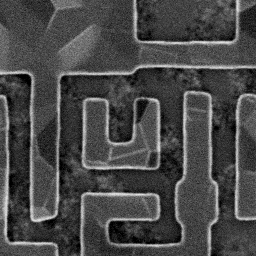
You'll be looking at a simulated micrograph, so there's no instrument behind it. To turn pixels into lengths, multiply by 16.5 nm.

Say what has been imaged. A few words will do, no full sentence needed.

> wiring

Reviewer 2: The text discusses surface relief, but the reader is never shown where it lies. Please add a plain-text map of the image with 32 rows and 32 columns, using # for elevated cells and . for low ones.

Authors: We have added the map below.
#################.............##
#################.............##
#################.............##
#################.............##
#################.............##
################################
################################
################################
#################...............
....####........................
....###.........................
....###.........................
#...###....##....##....###....##
#...###...####...###...###....##
#...###...####...###...###....##
#...###...###....###...###....##
#...###...###....###...###....##
#...###...####..####...###....##
#...###...##########...###....##
#...###...##########...###....##
#...###...##########...###....##
#...###................###....##
#...###................####...##
#...###...............#####...##
#...###...##########..#####...##
#...###...##########..#####...##
#...###...##########..#####...##
#...#.....####....#...#####.....
#.........###..........###......
#.........####.........###......
#######...#####.......####......
#######...################......